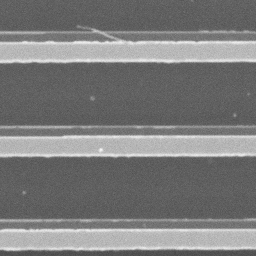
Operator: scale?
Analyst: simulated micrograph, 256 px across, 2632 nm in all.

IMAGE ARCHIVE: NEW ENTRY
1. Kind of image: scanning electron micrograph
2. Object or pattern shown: lines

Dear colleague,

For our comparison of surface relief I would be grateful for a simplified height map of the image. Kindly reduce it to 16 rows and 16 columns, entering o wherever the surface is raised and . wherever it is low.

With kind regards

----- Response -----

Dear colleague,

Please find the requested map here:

................
................
oooooooooooooooo
oooooooooooooooo
................
................
................
................
oooooooooooooooo
oooooooooooooooo
................
................
................
................
oooooooooooooooo
oooooooooooooooo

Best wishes